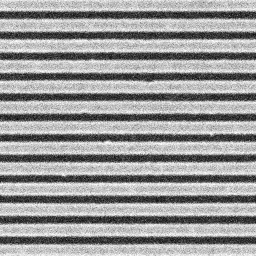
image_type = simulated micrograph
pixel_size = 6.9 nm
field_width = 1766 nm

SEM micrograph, parallel lines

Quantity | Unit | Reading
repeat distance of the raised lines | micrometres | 0.141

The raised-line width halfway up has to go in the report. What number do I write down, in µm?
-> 0.0768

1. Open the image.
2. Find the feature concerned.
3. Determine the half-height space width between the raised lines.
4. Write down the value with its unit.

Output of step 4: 64.7 nanometers